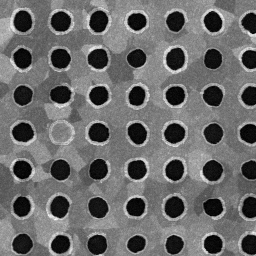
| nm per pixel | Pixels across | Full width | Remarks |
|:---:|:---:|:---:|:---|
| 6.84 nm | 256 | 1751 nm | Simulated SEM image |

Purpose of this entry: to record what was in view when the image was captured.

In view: a regular array of holes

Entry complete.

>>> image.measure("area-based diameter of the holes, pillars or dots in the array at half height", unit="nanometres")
139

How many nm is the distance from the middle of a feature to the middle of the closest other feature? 252